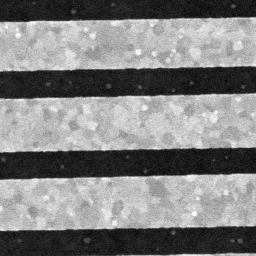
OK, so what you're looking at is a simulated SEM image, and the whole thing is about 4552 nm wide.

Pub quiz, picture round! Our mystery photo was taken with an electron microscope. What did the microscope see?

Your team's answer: lines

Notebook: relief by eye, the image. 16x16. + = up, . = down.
................
++++++++++++++++
++++++++++++++++
++++++++++++++++
................
................
++++++++++++++++
++++++++++++++++
++++++++++++++++
................
................
++++++++++++++++
++++++++++++++++
++++++++++++++++
................
................